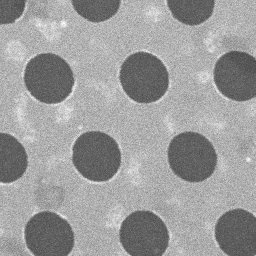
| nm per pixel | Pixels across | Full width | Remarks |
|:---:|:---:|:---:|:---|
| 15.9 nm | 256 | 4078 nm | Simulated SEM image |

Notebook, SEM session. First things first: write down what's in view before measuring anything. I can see holes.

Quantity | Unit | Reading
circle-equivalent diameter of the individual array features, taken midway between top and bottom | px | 51.1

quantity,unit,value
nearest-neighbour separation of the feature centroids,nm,1460